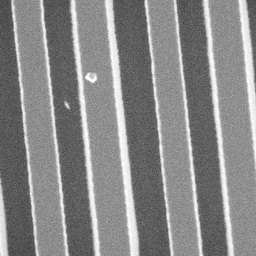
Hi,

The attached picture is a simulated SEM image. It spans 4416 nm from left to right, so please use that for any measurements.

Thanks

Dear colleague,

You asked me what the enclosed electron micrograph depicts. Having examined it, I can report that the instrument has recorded lines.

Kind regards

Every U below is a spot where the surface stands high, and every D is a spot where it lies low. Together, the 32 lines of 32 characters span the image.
DDUUUDDDDUUUUUDDDDUUUUDDDDUUUUDD
DDUUUDDDDUUUUUDDDDUUUUDDDDUUUUDD
DDUUUDDDDUUUUUDDDDUUUUDDDDUUUUDD
DDUUUUDDDUUUUUDDDDDUUUDDDDUUUUUD
DDUUUUDDDDUUUUDDDDDUUUDDDDUUUUUD
DDUUUUDDDDUUUUDDDDDUUUDDDDUUUUUD
DDUUUUDDDDUUUUDDDDDUUUUDDDUUUUUD
DDUUUUDDDDUUUUDDDDDUUUUDDDDUUUUD
DDUUUUDDDDUUUUDDDDDUUUUDDDDUUUUD
DDUUUUDDDDUUUUDDDDDUUUUDDDDUUUUD
DDDUUUDDDDUUUUUDDDDUUUUDDDDUUUUD
DDDUUUDDDDUUUUUDDDDUUUUDDDDUUUUD
DDDUUUDDDDUUUUUDDDDUUUUDDDDUUUUD
DDDUUUUDDDDUUUUDDDDDUUUDDDDUUUUU
DDDUUUUDDDDUUUUDDDDDUUUDDDDUUUUU
DDDUUUUDDDDUUUUDDDDDUUUDDDDUUUUU
DDDUUUUDDDDUUUUDDDDDUUUUDDDUUUUU
DDDUUUUDDDDUUUUDDDDDUUUUDDDDUUUU
DDDUUUUDDDDUUUUDDDDDUUUUDDDDUUUU
DDDUUUUDDDDUUUUDDDDDUUUUDDDDUUUU
DDDDUUUDDDDUUUUUDDDDUUUUDDDDUUUU
DDDDUUUDDDDUUUUUDDDDUUUUDDDDUUUU
DDDDUUUUDDDUUUUUDDDDUUUUDDDDUUUU
DDDDUUUUDDDUUUUUDDDDDUUUDDDDUUUU
DDDDUUUUDDDDUUUUDDDDDUUUDDDDUUUU
DDDDUUUUDDDDUUUUDDDDDUUUUDDDUUUU
DDDDUUUUDDDDUUUUDDDDDUUUUDDDUUUU
DDDDUUUUDDDDUUUUDDDDDUUUUDDDDUUU
DDDDUUUUDDDDUUUUDDDDDUUUUDDDDUUU
DDDDUUUUDDDDUUUUUDDDDUUUUDDDDUUU
DDDDUUUUDDDDUUUUUDDDDUUUUDDDDUUU
DDDDDUUUDDDDUUUUUDDDDUUUUDDDDUUU